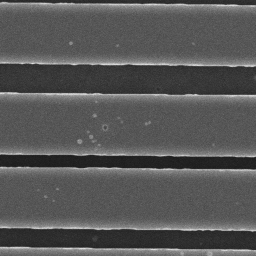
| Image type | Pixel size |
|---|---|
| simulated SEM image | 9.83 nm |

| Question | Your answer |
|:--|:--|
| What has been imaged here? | lines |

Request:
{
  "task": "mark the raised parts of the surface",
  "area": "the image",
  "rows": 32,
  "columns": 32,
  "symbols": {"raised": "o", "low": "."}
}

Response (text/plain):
oooooooooo......................
oooooooooooooooooooooooooooooooo
oooooooooooooooooooooooooooooooo
oooooooooooooooooooooooooooooooo
oooooooooooooooooooooooooooooooo
oooooooooooooooooooooooooooooooo
oooooooooooooooooooooooooooooooo
oooooooooooooooooooooooooooooooo
................................
................................
................................
................................
oooooooooooooooooooooooooooooooo
oooooooooooooooooooooooooooooooo
oooooooooooooooooooooooooooooooo
oooooooooooooooooooooooooooooooo
oooooooooooooooooooooooooooooooo
oooooooooooooooooooooooooooooooo
oooooooooooooooooooooooooooooooo
...........................o.ooo
................................
oooooooooooooooooooooooooooooooo
oooooooooooooooooooooooooooooooo
oooooooooooooooooooooooooooooooo
oooooooooooooooooooooooooooooooo
oooooooooooooooooooooooooooooooo
oooooooooooooooooooooooooooooooo
oooooooooooooooooooooooooooooooo
.o..oooooooooooooooooooooooooooo
................................
................................
oooooooooooooooooooooooooooooooo